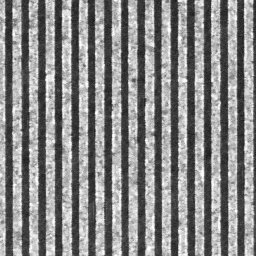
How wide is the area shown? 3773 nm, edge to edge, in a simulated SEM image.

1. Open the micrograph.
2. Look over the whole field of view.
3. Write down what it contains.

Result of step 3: parallel lines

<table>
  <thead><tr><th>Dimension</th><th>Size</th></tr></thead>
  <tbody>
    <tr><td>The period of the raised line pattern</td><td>244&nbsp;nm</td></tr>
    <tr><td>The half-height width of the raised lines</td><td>8.37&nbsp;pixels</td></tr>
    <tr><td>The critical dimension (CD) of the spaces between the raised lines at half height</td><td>123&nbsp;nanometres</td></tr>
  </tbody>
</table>